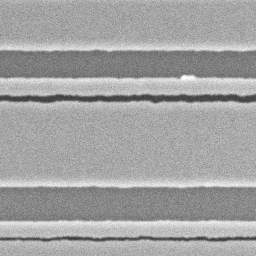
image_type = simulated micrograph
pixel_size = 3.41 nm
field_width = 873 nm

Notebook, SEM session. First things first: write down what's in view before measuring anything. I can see lines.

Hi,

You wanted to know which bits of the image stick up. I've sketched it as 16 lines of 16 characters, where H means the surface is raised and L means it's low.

HHHHHHHHHHHHHHHH
HHHHHHHHHHHHHHHH
HHHHHHHHHHHHHHHH
LLLLLLLLLLLLLLLL
LLLLLLLLLLLLLLLL
HHHHHHHHHHHHHHHH
HHHHHHHHHHHHHHHH
HHHHHHHHHHHHHHHH
HHHHHHHHHHHHHHHH
HHHHHHHHHHHHHHHH
HHHHHHHHHHHHHHHH
HHHHHHHHHHHHHHHH
LLLLLLLLLLLLLLLL
LLLLLLLLLLLLLLLL
HHHHHHHHHHHHHHHH
HHHHHHHHHHHHHHHH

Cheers